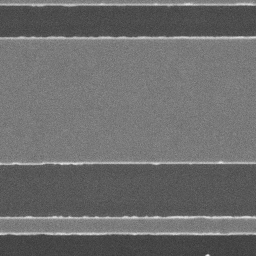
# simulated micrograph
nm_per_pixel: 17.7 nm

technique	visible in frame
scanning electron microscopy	lines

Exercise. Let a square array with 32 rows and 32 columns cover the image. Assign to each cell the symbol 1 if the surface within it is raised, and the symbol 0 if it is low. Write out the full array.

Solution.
11111111111111111111111111111111
00000000000000000000000000000000
00000000000000000000000000000000
00000000000000000000000000000000
00000000000000000000000000000000
11111111111111111111111111111111
11111111111111111111111111111111
11111111111111111111111111111111
11111111111111111111111111111111
11111111111111111111111111111111
11111111111111111111111111111111
11111111111111111111111111111111
11111111111111111111111111111111
11111111111111111111111111111111
11111111111111111111111111111111
11111111111111111111111111111111
11111111111111111111111111111111
11111111111111111111111111111111
11111111111111111111111111111111
11111111111111111111111111111111
11111101010000000001000000000000
00000000000000000000000000000000
00000000000000000000000000000000
00000000000000000000000000000000
00000000000000000000000000000000
00000000000000000000000000000000
00000000000000000000000000000000
11111111111111111111111111111111
11111111111111111111111111111111
00000000000000000000000000000000
00000000000000000000000000000000
00000000000000000000000000000000